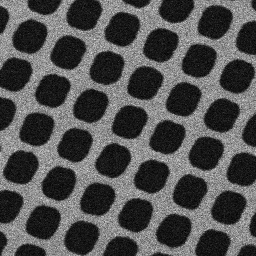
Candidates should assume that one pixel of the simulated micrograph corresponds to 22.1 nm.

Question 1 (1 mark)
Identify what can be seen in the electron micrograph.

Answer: a regular array of holes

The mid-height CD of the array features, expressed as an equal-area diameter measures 764 nm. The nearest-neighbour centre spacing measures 912 nm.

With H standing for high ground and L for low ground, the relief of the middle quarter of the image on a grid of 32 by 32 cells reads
LLLHHHHLLLLLLLLHHHHHHHHHHHHHHLLL
HHHHHHLLLLLLLLLHHHLLLLLHHHHHHHLL
HHHHHHLLLLLLLLLHHLLLLLLLLHHHHHLL
LHHHHHHLLLLLLLHHHLLLLLLLLHHHHHHH
LLHHHHHHLLLLLHHHLLLLLLLLLHHHHLLH
LLHHHHHHHHHHHHHHLLLLLLLLHHHHLLLL
LLHHHHLLHHHHHHHHLLLLLLLLHHHLLLLL
LHHHLLLLLLHHHHHHLLLLLLLHHHLLLLLL
LHHLLLLLLLLHHHHHHHLLLLHHHHLLLLLL
HHHLLLLLLLLHHHHHHHHHHHHHHLLLLLLL
HHLLLLLLLLLHHHHLLLHHHHHHHLLLLLLL
HHLLLLLLLLLHHHLLLLLLHHHHHHLLLLLL
HHLLLLLLLLHHHLLLLLLLLHHHHHHLLLLL
HHHLLLLLLHHHHLLLLLLLLHHHHHHHHHHH
HHHHHLLLHHHHLLLLLLLLLHHHLLLLHHHH
HHHHHHHHHHHHLLLLLLLLHHHLLLLLLLHH
HLLLLHHHHHHHLLLLLLLLHHHLLLLLLLHH
LLLLLLLHHHHHHLLLLLLHHHLLLLLLLLHH
LLLLLLLHHHHHHHHLLLHHHHLLLLLLLLHH
LLLLLLLHHHHHHHHHHHHHHLLLLLLLLLHH
LLLLLLLHHHLLLLLHHHHHHLLLLLLLLHHH
LLLLLLLHHHLLLLLLHHHHHHLLLLLLHHHH
LLLLLLHHHLLLLLLLLHHHHHHHHLLHHHHL
LLLLLHHHLLLLLLLLLHHHHHHHHHHHHHHL
HHLLHHHHLLLLLLLLLHHHLLLLLHHHHHHL
HHHHHHHHLLLLLLLLHHHLLLLLLLHHHHHH
LLHHHHHHLLLLLLLLHHLLLLLLLLHHHHHH
LLLHHHHHHLLLLLLHHHLLLLLLLLHHHHHH
LLLHHHHHHHHHLHHHHLLLLLLLLLHHHLLL
LLLHHHHHHHHHHHHHHLLLLLLLLLHHLLLL
LLLHHHLLLLLLHHHHHHLLLLLLLHHHLLLL
LLHHHLLLLLLLLHHHHHHLLLLLHHHLLLLL